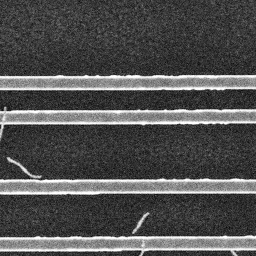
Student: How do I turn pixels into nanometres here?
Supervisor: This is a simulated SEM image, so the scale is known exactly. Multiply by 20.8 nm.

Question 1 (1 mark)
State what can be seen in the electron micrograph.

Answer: lines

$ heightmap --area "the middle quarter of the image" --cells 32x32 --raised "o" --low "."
................................
................................
................................
oooooooooooooooooooooooooooooooo
oooooooooooooooooooooooooooooooo
oooooooooooooooooooooooooooooooo
................................
................................
................................
................................
................................
................................
oooooooooooooooooooooooooooooooo
oooooooooooooooooooooooooooooooo
oooooooooooooooooooooooooooooooo
................................
................................
................................
................................
................................
................................
................................
................................
................................
................................
................................
................................
................................
................................
oooooooooooooooooooooooooooooooo
oooooooooooooooooooooooooooooooo
oooooooooooooooooooooooooooooooo